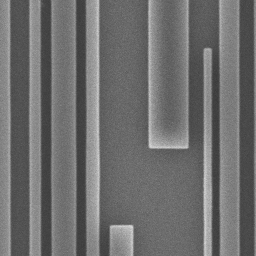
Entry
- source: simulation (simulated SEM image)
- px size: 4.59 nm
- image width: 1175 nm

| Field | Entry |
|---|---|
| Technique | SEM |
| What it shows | groups of lines, slits or small figures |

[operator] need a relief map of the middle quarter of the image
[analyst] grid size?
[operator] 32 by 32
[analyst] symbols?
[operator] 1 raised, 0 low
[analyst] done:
11100011100000000000011111111110
11100011100000000000011111111110
11100011100000000000011111111110
11100011100000000000011111111110
11100011100000000000011111111110
11100011100000000000011111111110
11100011100000000000011111111110
11100011100000000000011111111110
11100011100000000000011111111110
11100011100000000000011111111110
11100011100000000000011111111110
11100011100000000000011111111110
11100011100000000000011111111110
11100011100000000000011111111110
11100011100000000000011111111110
11100011100000000000011111111110
11100011100000000000011111111110
11100011100000000000011111111110
11100011100000000000011111111110
11100011100000000000011111111110
11100011100000000000011111111110
11100011100000000000000000000000
11100011100000000000000000000000
11100011100000000000000000000000
11100011100000000000000000000000
11100011100000000000000000000000
11100011100000000000000000000000
11100011100000000000000000000000
11100011100000000000000000000000
11100011100000000000000000000000
11100011100000000000000000000000
11100011100000000000000000000000